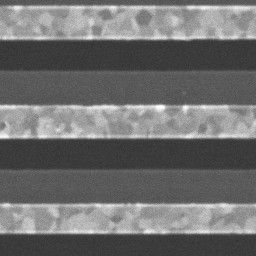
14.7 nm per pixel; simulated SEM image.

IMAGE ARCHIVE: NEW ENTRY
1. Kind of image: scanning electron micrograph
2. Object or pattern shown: lines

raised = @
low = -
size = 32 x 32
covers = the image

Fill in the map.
@@@@@@@@@@@@@@@@@@@@@@@@@@@@@@@@
@@@@@@@@@@@@@@@@@@@@@@@@@@@@@@@@
@@@@@@@@@@@@@@@@@@@@@@@@@@@@@@@@
@@@@@@@@@@@@@@@@@@@@@@@@@@@@@@@@
@@@@@@@@@@@@@@@@@@@@@@@@@@@@@@@@
--------------------------------
--------------------------------
--------------------------------
--------------------------------
@@@@@@@@@@@@@@@@@@@@@@@@@@@@@@@@
@@@@@@@@@@@@@@@@@@@@@@@@@@@@@@@@
@@@@@@@@@@@@@@@@@@@@@@@@@@@@@@@@
@@@@@@@@@@@@@@@@@@@@@@@@@@@@@@@@
@@@@@@@@@@@@@@@@@@@@@@@@@@@@@@@@
@@@@@@@@@@@@@@@@@@@@@@@@@@@@@@@@
@@@@@@@@@@@@@@@@@@@@@@@@@@@@@@@@
@@@@@@@@@@@@@@@@@@@@@@@@@@@@@@@@
--------------------------------
--------------------------------
--------------------------------
--------------------------------
@@@@@@@@@@@@@@@@@@@@@@@@@@@@@@@@
@@@@@@@@@@@@@@@@@@@@@@@@@@@@@@@@
@@@@@@@@@@@@@@@@@@@@@@@@@@@@@@@@
@@@@@@@@@@@@@@@@@@@@@@@@@@@@@@@@
@@@@@@@@@@@@@@@@@@@@@@@@@@@@@@@@
@@@@@@@@@@@@@@@@@@@@@@@@@@@@@@@@
@@@@@@@@@@@@@@@@@@@@@@@@@@@@@@@@
@@@@@@@@@@@@@@@@@@@@@@@@@@@@@@@@
--------------------------------
--------------------------------
--------------------------------